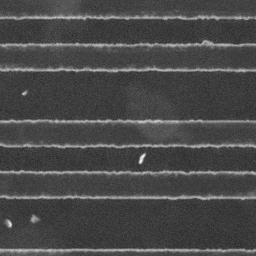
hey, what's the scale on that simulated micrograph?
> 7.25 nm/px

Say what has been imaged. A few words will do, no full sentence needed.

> lines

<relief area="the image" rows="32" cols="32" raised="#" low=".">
################################
################################
................................
................................
................................
................................
################################
################################
################################
................................
................................
................................
................................
................................
................................
################################
################################
################################
................................
................................
................................
#############.###.#.###.######..
################################
################################
################################
................................
................................
................................
................................
................................
................................
################################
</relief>